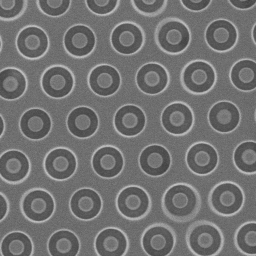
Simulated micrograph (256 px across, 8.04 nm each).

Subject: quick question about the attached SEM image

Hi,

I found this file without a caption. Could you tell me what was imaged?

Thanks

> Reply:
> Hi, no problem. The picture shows an array of small figures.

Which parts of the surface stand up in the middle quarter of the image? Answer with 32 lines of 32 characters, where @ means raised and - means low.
@@@@@@@@---@@@@@@@@@----@@@@@@@-
-@@@@@@------@@@@@@------@@@@@--
--@@@@@--@@---@@@@---@@---@@@@--
--@@@@---@@@--@@@@---@@@--@@@@--
--@@@@--@@@@--@@@@---@@---@@@@--
--@@@@---@@---@@@@@-------@@@@--
--@@@@@------@@@@@@------@@@@@@-
-@@@@@@@----@@@@@@@@@--@@@@@@@@@
@@@@@@@@@@@@@@@@@@@@@@@@@@@@@@@@
@@@@@@@@@@@@@@@@@@@@@@@@@@@@@@@@
@@@@@@@@@@@@@@@---@@@@@@@@-----@
@@-----@@@@@@@-----@@@@@@-------
@-------@@@@@-------@@@@@--@@---
@--@@@--@@@@@--@@@--@@@@---@@@--
@--@@@---@@@---@@@--@@@@@--@@---
@--@@@--@@@@@---@---@@@@@-------
@-------@@@@@-------@@@@@@-----@
@@-----@@@@@@@----@@@@@@@@@--@@@
@@@@@@@@@@@@@@@@@@@@@@@@@@@@@@@@
@@@@@@@@@@@@@@@@@@@@@@@@@@@@@@@@
@@@@@@@@@@-@@@@@@@@@@---@@@@@@@@
-@@@@@@@------@@@@@@------@@@@@-
--@@@@@@------@@@@@---@@--@@@@@-
---@@@@---@@---@@@@--@@@---@@@@-
@--@@@@--@@@@--@@@@--@@@@--@@@@-
@--@@@@---@@---@@@@---@@--@@@@@-
---@@@@@------@@@@@@------@@@@@@
--@@@@@@------@@@@@@@----@@@@@@@
-@@@@@@@@@@-@@@@@@@@@@@@@@@@@@@@
@@@@@@@@@@@@@@@@@@@@@@@@@@@@@@@@
@@@@@@@@@@@@@@@@@@@@@@@@@@@----@
@@@@---@@@@@@@@-----@@@@@@------